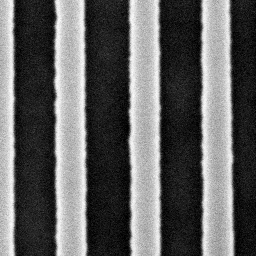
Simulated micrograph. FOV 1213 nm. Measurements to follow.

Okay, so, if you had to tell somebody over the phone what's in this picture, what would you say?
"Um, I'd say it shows lines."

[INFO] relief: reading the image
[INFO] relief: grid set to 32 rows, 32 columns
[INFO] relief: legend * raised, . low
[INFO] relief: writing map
**.....***......****.....****...
**.....***......****.....****...
**.....***......****.....****...
**.....****.....****.....****...
**.....***......****.....****...
**.....****.....****.....****...
**.....****.....****.....****...
**.....****.....****.....****...
**.....****.....****.....****...
**.....****.....****.....****...
**.....****.....****.....****...
**.....****.....****.....****...
**.....****.....****.....****...
**.....****.....****.....****...
**.....****.....****.....****...
**.....****.....****.....****...
**.....****.....****.....****...
**.....****.....****.....****...
**.....****.....****.....****...
**.....****.....****.....****...
**.....****.....****.....****...
**.....****.....****.....****...
**.....****......***......***...
**.....****.....****......***...
**.....****.....****......***...
**.....****.....****.....****...
**.....****.....****.....****...
**.....****.....****.....****...
**.....****.....****.....****...
**.....****......***.....****...
**.....****.....****.....****...
**.....****......***.....****...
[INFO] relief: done